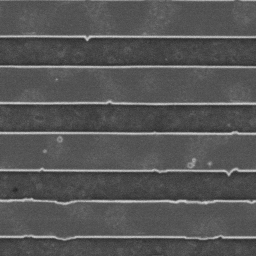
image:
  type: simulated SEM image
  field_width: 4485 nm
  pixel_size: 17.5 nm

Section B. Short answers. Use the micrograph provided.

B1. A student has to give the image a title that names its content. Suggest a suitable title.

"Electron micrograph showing one or a few lines or trenches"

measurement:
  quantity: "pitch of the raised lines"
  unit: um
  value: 1.18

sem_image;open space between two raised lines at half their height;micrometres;0.526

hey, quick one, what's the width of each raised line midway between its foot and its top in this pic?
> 648 nanometers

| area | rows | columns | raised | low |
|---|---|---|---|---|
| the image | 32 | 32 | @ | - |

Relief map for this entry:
@@@@@@@@@@@@@@@@@@@@@@@@@@@@@@@@
@@@@@@@@@@@@@@@@@@@@@@@@@@@@@@@@
@@@@@@@@@@@@@@@@@@@@@@@@@@@@@@@@
@@@@@@@@@@@@@@@@@@@@@@@@@@@@@@@@
@@@@@@@@@@@@@@@@@@@@@@@@@@@@@@@@
--------------------------------
--------------------------------
--------------------------------
@@@@@@@@@@@@@@@@@@@@@@@@@@@@@@@@
@@@@@@@@@@@@@@@@@@@@@@@@@@@@@@@@
@@@@@@@@@@@@@@@@@@@@@@@@@@@@@@@@
@@@@@@@@@@@@@@@@@@@@@@@@@@@@@@@@
@@@@@@@@@@@@@@@@@@@@@@@@@@@@@@@@
--------------------------------
--------------------------------
--------------------------------
--------------------------------
@@@@@@@@@@@@@@@@@@@@@@@@@@@@@@@@
@@@@@@@@@@@@@@@@@@@@@@@@@@@@@@@@
@@@@@@@@@@@@@@@@@@@@@@@@@@@@@@@@
@@@@@@@@@@@@@@@@@@@@@@@@@@@@@@@@
----------------------------@---
--------------------------------
--------------------------------
--------------------------------
@@@@@@@@@@@@@@@@@@@@@@@@@@@@@@@@
@@@@@@@@@@@@@@@@@@@@@@@@@@@@@@@@
@@@@@@@@@@@@@@@@@@@@@@@@@@@@@@@@
@@@@@@@@@@@@@@@@@@@@@@@@@@@@@@@@
@@@-@@@@@@@@@@@@@@@@@@@@@@@@@@@@
--------------------------------
--------------------------------